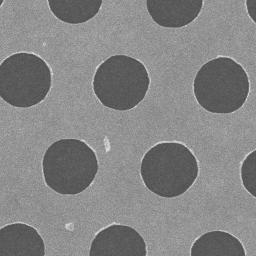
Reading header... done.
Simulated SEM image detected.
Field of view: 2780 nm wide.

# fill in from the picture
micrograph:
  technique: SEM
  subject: holes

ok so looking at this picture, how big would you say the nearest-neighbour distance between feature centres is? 1.07 µm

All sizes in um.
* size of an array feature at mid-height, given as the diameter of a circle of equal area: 0.606